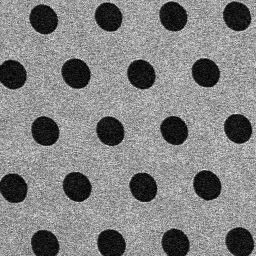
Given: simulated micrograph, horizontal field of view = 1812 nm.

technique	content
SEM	a regular array of holes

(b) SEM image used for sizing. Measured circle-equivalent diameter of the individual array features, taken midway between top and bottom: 205 nm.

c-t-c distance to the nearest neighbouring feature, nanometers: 452